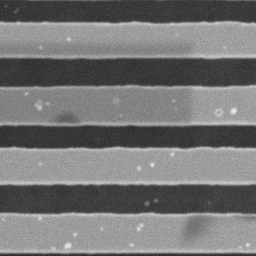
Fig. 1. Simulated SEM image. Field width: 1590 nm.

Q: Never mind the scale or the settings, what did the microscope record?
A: lines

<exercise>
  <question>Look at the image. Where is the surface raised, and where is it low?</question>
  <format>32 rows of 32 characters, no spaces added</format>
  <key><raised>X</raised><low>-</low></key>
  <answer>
--------------------------------
--------------------------------
--------------------------------
XXXXXXXXXXXXXXXXXXXXXXXXXXXXXXXX
XXXXXXXXXXXXXXXXXXXXXXXXXXXXXXXX
XXXXXXXXXXXXXXXXXXXXXXXXXXXXXXXX
XXXXXXXXXXXXXXXXXXXXXXXXXXXXXXXX
--------------------------------
--------------------------------
--------------------------------
--------------------------------
XXXXXXXXXXXXXXXXXXXXXXXXXXXXXXXX
XXXXXXXXXXXXXXXXXXXXXXXXXXXXXXXX
XXXXXXXXXXXXXXXXXXXXXXXXXXXXXXXX
XXXXXXXXXXXXXXXXXXXXXXXXXXXXXXXX
XXXXXXXXXXXXXXXXXXXXXXXXXXXXXXXX
--------------------------------
--------------------------------
-X------------XX--------XXXXXX--
XXXXXXXXXXXXXXXXXXXXXXXXXXXXXXXX
XXXXXXXXXXXXXXXXXXXXXXXXXXXXXXXX
XXXXXXXXXXXXXXXXXXXXXXXXXXXXXXXX
XXXXXXXXXXXXXXXXXXXXXXXXXXXXXXXX
--------------------------------
--------------------------------
--------------------------------
--------------------------------
XXXXXXXXXXXXXXXXXXXXXXXXXXXXXXXX
XXXXXXXXXXXXXXXXXXXXXXXXXXXXXXXX
XXXXXXXXXXXXXXXXXXXXXXXXXXXXXXXX
XXXXXXXXXXXXXXXXXXXXXXXXXXXXXXXX
XXXXXXXXXXXXXXXXXXXXXXXXXXXXXXXX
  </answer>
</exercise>